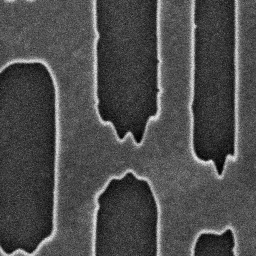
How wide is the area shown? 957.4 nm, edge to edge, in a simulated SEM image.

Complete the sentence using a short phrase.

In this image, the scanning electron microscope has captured one or a few lines or trenches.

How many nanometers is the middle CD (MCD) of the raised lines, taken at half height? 152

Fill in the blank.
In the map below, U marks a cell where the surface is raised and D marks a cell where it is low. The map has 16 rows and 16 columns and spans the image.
UUUUUUDDDDUUDDDU
UUUUUUDDDDUUDDDU
UUUUUUDDDDUUDDDU
UUUUUUDDDDUUDDDU
DDDUUUDDDDUUDDDU
DDDUUUDDDDUUDDDU
DDDDUUDDDDUUDDDU
DDDDUUDDDUUUDDDU
DDDDUUUUDUUUDDDU
DDDDUUUUUUUUDDDU
DDDDUUUUUUUUUDUU
DDDUUUUDDUUUUUUU
DDDUUUDDDDUUUUUU
DDDUUUDDDDUUUUUU
DDDUUUDDDDUUUUUU
DDUUUUDDDDUUDDDU